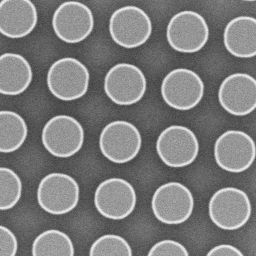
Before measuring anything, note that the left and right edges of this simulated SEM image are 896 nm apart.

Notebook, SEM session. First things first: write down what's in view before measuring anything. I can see an array of small figures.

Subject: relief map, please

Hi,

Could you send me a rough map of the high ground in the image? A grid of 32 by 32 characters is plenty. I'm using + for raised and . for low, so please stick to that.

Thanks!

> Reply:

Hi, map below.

++++....++......................
++++...++++...++++.....+........
+++++..+++++..+++++..++++....+++
++++...+++++..+++++..+++++..++++
.++....++++...+++++..+++++..++++
...............+++...++++...++++
.............................+++
+++....++.......................
++++..+++++...+++...............
++++..+++++..+++++...++++....++.
++++..+++++..+++++..+++++...++++
+++...+++++..+++++..+++++..+++++
........+.....+++....++++..+++++
......................++....++++
++.....+........................
+++...++++....++................
+++..+++++...++++...++++....++..
+++..+++++...+++++..+++++..++++.
++....++++...++++...+++++..+++++
.......++....++++...++++...+++++
.....................++....++++.
++..............................
++...++++.....+.................
+++..+++++..++++....+++.........
++...+++++..+++++..+++++...++++.
++...++++...+++++..+++++..+++++.
......++.....+++...+++++..+++++.
....................+++....++++.
+...........................++..
++...+++.....+..................
++..+++++...++++....++..........
++..+++++..+++++...++++...++++..